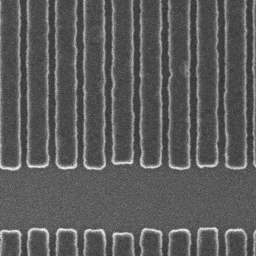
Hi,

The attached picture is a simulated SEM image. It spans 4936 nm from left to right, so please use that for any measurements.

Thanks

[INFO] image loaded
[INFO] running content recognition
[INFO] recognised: parallel lines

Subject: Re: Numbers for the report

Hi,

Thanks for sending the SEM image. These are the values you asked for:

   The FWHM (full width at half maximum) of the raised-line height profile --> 0.395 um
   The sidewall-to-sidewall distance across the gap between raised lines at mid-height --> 154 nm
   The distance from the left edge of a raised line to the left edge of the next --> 545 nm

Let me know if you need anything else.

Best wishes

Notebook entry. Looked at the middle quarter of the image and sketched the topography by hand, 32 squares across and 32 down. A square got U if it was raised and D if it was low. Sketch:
UUUDDUUUUUDDUUUUUDDUUUUUDDUUUUUD
UUUDDUUUUUDDUUUUUDDUUUUUDDDUUUUD
UUUDDUUUUUDDUUUUUDDUUUUUDDDUUUUD
UUUDDUUUUUDDUUUUUDDUUUUUDDUUUUUD
UUUDDUUUUUDDUUUUUDDUUUUUDDUUUUUD
UUUDDUUUUUDDUUUUUDDUUUUUDDUUUUUD
UUUDDUUUUUDDUUUUUDDUUUUUDDUUUUUD
UUUDDUUUUUDDUUUUUDDUUUUUDDUUUUUD
UUUDDUUUUUDDUUUUUDDUUUUUDDUUUUUD
UUUDDUUUUUDDUUUUUDDUUUUUDDUUUUUD
UUUDDUUUUUDDUUUUUDDUUUUUDDUUUUUD
UUUDDUUUUUDDUUUUUDDUUUUUDDUUUUUD
UUUDDUUUUUDDUUUUUDDUUUUUDDUUUUUD
UUUDDUUUUUDDUUUUUUDUUUUUDDUUUUUD
UUUDDUUUUUDDUUUUUDDUUUUUDDUUUUUD
UUUDDUUUUUDDUUUUUDDUUUUUDDUUUUUU
UUUDDUUUUUDDUUUUUDDUUUUUDDUUUUUD
UUUDDUUUUUDDUUUUUDDUUUUUDDUUUUUD
UUUDDUUUUUDDUUUUUDDUUUUUDDUUUUUD
UUUDDUUUUUDDUUUUUDDUUUUUDDUUUUUD
UUUDDUUUUUDDUUUUUDDUUUUUDDUUUUUD
UUUDDUUUUUDDUUUUUDDDUUUUDDUUUUUD
UUUDDUUUUUDDUUUUUDDDUUUUDDUUUUUD
UUUDDUUUUUDDUUUUUDDUUUUUDDUUUUUD
UUUDDUUUUUDDUUUUUDDUUUUUDDUUUUUD
UUUDDUUUUUDDDDDDDDDDUUUUDDDUUUUD
DDDDDDDDDDDDDDDDDDDDDDDDDDDDDDDD
DDDDDDDDDDDDDDDDDDDDDDDDDDDDDDDD
DDDDDDDDDDDDDDDDDDDDDDDDDDDDDDDD
DDDDDDDDDDDDDDDDDDDDDDDDDDDDDDDD
DDDDDDDDDDDDDDDDDDDDDDDDDDDDDDDD
DDDDDDDDDDDDDDDDDDDDDDDDDDDDDDDD